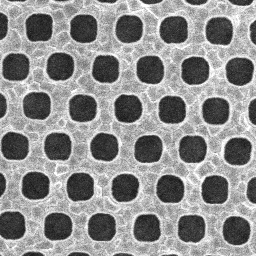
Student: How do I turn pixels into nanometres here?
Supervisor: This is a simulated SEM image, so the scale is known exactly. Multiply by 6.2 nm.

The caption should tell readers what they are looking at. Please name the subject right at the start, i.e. a regular array of holes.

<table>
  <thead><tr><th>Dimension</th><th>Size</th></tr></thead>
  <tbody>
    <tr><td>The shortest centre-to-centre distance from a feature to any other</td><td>276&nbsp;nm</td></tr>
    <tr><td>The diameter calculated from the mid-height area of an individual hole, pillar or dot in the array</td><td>30.1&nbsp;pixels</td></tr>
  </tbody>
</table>